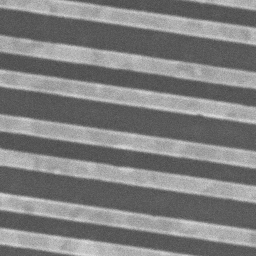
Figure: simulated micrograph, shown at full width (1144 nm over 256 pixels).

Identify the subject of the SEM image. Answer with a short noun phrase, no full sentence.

parallel lines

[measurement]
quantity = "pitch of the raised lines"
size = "176 nanometers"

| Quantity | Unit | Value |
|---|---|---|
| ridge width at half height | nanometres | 63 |